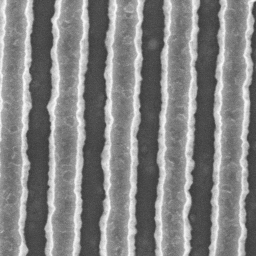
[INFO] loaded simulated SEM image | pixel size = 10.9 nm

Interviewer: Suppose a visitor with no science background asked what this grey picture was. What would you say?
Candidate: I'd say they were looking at parallel lines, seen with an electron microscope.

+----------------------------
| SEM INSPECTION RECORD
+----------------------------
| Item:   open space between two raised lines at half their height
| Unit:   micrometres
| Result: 0.298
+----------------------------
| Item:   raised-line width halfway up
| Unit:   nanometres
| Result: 309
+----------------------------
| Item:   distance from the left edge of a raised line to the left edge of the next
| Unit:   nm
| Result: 602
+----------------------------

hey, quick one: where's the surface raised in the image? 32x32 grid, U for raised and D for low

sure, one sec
UUUUDDDUUUUDDDUUUUDDDUUUUDDDUUUU
UUUUDDDUUUUDDDUUUDDDDUUUDDDDUUUD
UUUUDDDUUUUDDDUUUUDDDUUUDDDDUUUD
UUUUDDDUUUUDDDUUUDDDDUUUDDDDUUUD
UUUUDDDUUUUDDDUUUDDDDUUUDDDDUUUD
UUUDDDDUUUDDDDUUUDDDDUUUDDDDUUUD
UUUDDDDUUUDDDDUUUDDDDUUUDDDDUUUD
UUUDDDDUUUDDDDUUUDDDDUUUDDDDUUUD
UUUDDDDUUUDDDDUUUDDDDUUUDDDUUUUD
UUUDDDDUUUDDDDUUUDDDDUUUDDDUUUUD
UUUDDDDUUUDDDDUUUDDDUUUUDDDUUUUD
UUUDDDDUUUDDDDUUUDDDDUUUDDDUUUUD
UUUDDDDUUUDDDDUUUDDDDUUUDDDUUUUD
UUUDDDUUUUDDDDUUUDDDDUUUDDDUUUUD
UUUDDDDUUUDDDDUUUDDDUUUUDDDUUUUD
UUUDDDDUUUDDDDUUUDDDUUUUDDDUUUUD
UUUDDDUUUUDDDUUUUDDDUUUUDDDUUUUD
UUUDDDUUUUDDDDUUUDDDUUUUDDDUUUUD
UUUDDDDUUUDDDUUUUDDDUUUUDDDUUUUD
UUUDDDDUUUDDDUUUUDDDUUUUDDDUUUUD
UUUDDDDUUUDDDUUUUDDDUUUUDDDUUUDD
UUUDDDDUUUDDDUUUUDDDUUUDDDDUUUDD
UUUDDDUUUUDDDUUUUDDDUUUUDDDUUUDD
UUUDDDUUUUDDDDUUUDDDUUUDDDDUUUUD
UUUDDDUUUUDDDUUUUDDDUUUUDDDUUUDD
UUUDDDUUUUDDDUUUUDDDUUUUDDDUUUDD
UUUDDDUUUUDDDUUUUDDDUUUDDDDUUUDD
UUUDDDUUUUDDDUUUDDDDUUUDDDDUUUDD
UUUDDDUUUUDDDUUUUDDDUUUDDDDUUUDD
UUUDDDUUUUDDDUUUDDDDUUUDDDDUUUDD
UUUDDDUUUUDDDUUUDDDDUUUDDDDUUUDD
UUUDDDUUUDDDDUUUDDDDUUUDDDDUUUDD